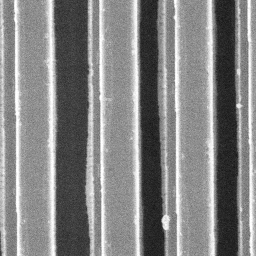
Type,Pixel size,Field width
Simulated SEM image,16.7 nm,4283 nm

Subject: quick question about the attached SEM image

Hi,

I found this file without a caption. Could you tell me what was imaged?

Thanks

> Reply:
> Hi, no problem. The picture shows lines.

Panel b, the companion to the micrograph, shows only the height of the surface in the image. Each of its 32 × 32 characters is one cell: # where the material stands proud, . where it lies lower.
######.....######...######....##
######.....######...######....##
######.....######...#######...##
######.....######...#######...##
######.....######...#######...##
#######....######....######...##
#######....######....######...##
#######....######....######...##
#######....######....######...##
#######....######....######...##
#######....######....######...##
#######....######....######...##
#######....######....######...##
#######....######....######...##
#######....######....######...##
#######....######....######...##
#######....######....######...##
#######....######....######...##
#######....######....######...##
#######....######....######...##
#######....######....######...##
#######....######....######...##
#######....######....######...##
#######....######....######...##
#######....######....######...##
#######....######....######...##
#######....######....######...##
#######.....#####...#######...##
#######.....#####....######...##
.######.....#####....######...##
.######.....#####....######...##
.######.....#####....######...##